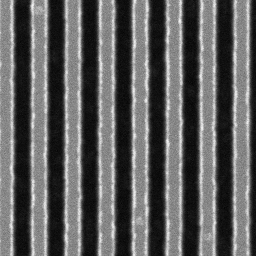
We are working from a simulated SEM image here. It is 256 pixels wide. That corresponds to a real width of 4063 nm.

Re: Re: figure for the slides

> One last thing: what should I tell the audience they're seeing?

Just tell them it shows parallel lines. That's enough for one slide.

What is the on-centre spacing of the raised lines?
535 nm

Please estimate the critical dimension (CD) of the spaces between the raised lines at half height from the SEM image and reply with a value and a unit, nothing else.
246 nm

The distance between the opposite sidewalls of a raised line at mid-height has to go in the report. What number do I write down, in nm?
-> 290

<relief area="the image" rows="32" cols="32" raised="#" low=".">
##..##..##..##..###..##..##..##.
##..##..##..##..###..##..##..##.
##..##..##..##..###..##..##..##.
##..##..##..##..###..##..##..##.
##..##..##..##...##..##..##..##.
##..##..##..##...##..##..##..##.
##..##..##..##..###..##..##..##.
##..##..##..##..###..##..##..##.
##..##..##..##...##..##..##..##.
##..##..##..##..###..##..##..##.
##..##..##..##..###..##..##..##.
##..##..##..##..###..##..##..##.
##..##..##..##...##..##..##..##.
##..##..##..##..###..##..##..##.
##..##..##..##..###..##..##..##.
##..##..##..##..###..##..##..##.
##..##..##..##...##..##..##..##.
##..##..##..##...##..##..##..##.
##..##..##..##...##..##..##..##.
##..##..##..##..###..##..##..##.
##..##..##..##..###..##..##..##.
##..##..##..##..###..##..##..##.
##..##..##..##..###..##..##..##.
##..##..##..##..###..##..##..##.
##..##..##..##..###..##..##..##.
##..##..##..##..###..##..##..##.
##..##..##..##..###..##..##..##.
##..##..##..##..###..##..##..##.
##..##..##..##..###..##..##..##.
##..##..##..##..###..##..##..##.
##..##..##..##..###..##..##..##.
##..##..##..##..###..##..##..##.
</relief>